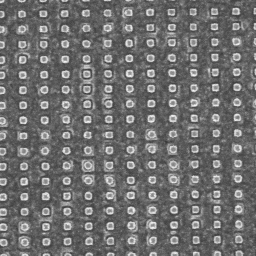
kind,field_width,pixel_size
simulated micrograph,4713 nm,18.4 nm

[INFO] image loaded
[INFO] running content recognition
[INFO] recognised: a regular array of raised bodies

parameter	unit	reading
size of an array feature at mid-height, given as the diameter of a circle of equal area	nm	125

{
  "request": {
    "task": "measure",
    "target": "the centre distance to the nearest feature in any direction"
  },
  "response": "276 nanometres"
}